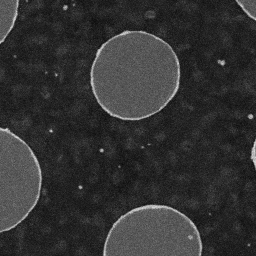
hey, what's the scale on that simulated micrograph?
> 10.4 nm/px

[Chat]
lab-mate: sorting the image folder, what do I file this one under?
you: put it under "raised bodies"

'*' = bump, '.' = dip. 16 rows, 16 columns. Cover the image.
*..............*
*...............
.......***......
......*****.....
......*****.....
......*****.....
......****......
................
*...............
**..............
**..............
***.............
**..............
**......****....
.......*****....
.......******...